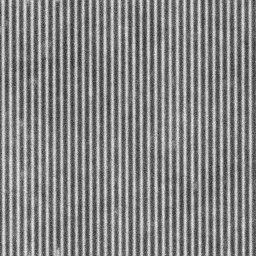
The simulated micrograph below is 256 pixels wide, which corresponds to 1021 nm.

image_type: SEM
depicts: parallel lines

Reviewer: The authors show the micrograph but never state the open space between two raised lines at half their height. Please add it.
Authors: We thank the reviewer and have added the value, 22.4 nm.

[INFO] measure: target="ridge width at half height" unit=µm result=0.0065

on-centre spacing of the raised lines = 29 nanometres